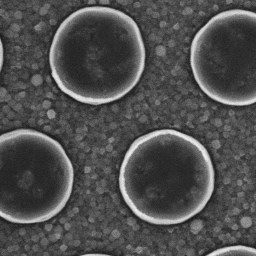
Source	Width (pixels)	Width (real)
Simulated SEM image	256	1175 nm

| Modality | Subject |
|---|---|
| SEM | raised bodies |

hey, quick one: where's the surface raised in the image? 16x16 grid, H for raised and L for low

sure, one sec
LLLLLLLLLLLLLLLL
LLLLHHHHLLLLLHHH
LLLHHHHHHLLLHHHH
LLLHHHHHHLLLHHHH
LLLHHHHHHLLLHHHH
LLLLHHHHLLLLLHHH
LLLLLLLLLLLLLLLL
LLLLLLLLLLLLLLLL
LHHLLLLLLHHHLLLL
HHHHLLLLHHHHHLLL
HHHHLLLLHHHHHLLL
HHHHLLLLHHHHHLLL
HHHHLLLLHHHHHLLL
HHHLLLLLLHHHLLLL
LLLLLLLLLLLLLLLL
LLLLLLLLLLLLLLHL